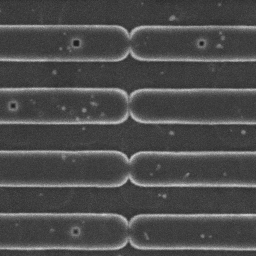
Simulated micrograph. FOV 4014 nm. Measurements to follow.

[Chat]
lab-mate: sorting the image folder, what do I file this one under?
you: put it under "wiring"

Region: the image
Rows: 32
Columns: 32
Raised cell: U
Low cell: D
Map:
DDDDDDDDDDDDDDDDDDDDDDDDDDDDDDDD
DDDDDDDDDDDDDDDDDDDDDDDDDDDDDDDD
DDDDDDDDDDDDDDDDDDDDDDDDDDDDDDDD
UUUUUUUUUUUUUUUDDUUUUUUUUUUUUUUU
UUUUUUUUUUUUUUUUUUUUUUUUUUUUUUUU
UUUUUUUUUDUUUUUUUUUUUUUUUUUUUUUU
UUUUUUUUUUUUUUUUUUUUUUUUUUUUUUUU
UUUUUUUUUUUUUUUDDDUUUUUUUUUUUUUU
DDDDDDDDDDDDDDDDDDDDDDDDDDDDDDDD
DDDDDDDDDDDDDDDDDDDDDDDDDDDDDDDD
DDDDDDDDDDDDDDDDDDDDDDDDDDDDDDDD
UUUUUUUUUUUUUUUDDUUUUUUUUUUUUUUU
UUUUUUUUUUUUUUUUUUUUUUUUUUUUUUUU
UUUUUUUUUUUUUUUUUUUUUUUUUUUUUUUU
UUUUUUUUUUUUUUUUUUUUUUUUUUUUUUUU
DDDDDDDDDDDDDDDDDDDDDDDDDDDDDDDD
DDDDDDDDDDDDDDDDDDDDDDDDDDDDDDDD
DDDDDDDDDDDDDDDDDDDDDDDDDDDDDDDD
DDDDDDDDDDDDDDDDDDDDDDDDDDDDDDDD
UUUUUUUUUUUUUUUUDUUUUUUUUUUUUUUU
UUUUUUUUUUUUUUUUUUUUUUUUUUUUUUUU
UUUUUUUUUUUUUUUUUUUUUUUUUUUUUUUU
UUUUUUUUUUUUUUUUUUUUUUUUUUUUUUUU
DDDDDDDDDDDDDDDDDDDDDDDDDDDDDDDD
DDDDDDDDDDDDDDDDDDDDDDDDDDDDDDDD
DDDDDDDDDDDDDDDDDDDDDDDDDDDDDDDD
DDDDDDDDDDDDDDDDDDDDDDDDDDDDDDDD
UUUUUUUUUUUUUUUUDUUUUUUUUUUUUUUU
UUUUUUUUUUUUUUUUUUUUUUUUUUUUUUUU
UUUUUUUUUUUUUUUUUUUUUUUUUUUUUUUU
UUUUUUUUUUUUUUUUDUUUUUUUUUUUUUUU
DDDDDDDDDDDDDDDDDDDDDDDDDDDDDDDD